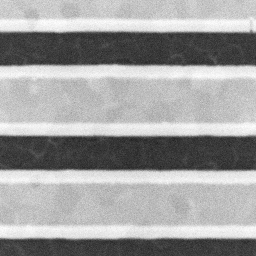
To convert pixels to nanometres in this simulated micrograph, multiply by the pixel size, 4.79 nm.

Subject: one or a few lines or trenches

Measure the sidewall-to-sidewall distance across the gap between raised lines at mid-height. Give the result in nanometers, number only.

220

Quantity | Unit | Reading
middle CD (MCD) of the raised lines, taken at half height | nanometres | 274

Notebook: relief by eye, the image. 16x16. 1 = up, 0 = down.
1111111111111111
1111111111111111
0000000000000000
0000000000000000
0110001100000000
1111111111111111
1111111111111111
1111111111111111
0000000000000000
0000000000000000
0000000000000000
1111111111111111
1111111111111111
1111111111111111
0000100000001111
0000000000000000